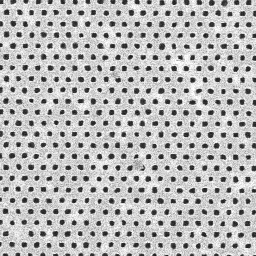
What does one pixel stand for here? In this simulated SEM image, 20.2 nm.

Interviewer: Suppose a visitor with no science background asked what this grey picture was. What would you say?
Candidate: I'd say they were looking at a regular array of holes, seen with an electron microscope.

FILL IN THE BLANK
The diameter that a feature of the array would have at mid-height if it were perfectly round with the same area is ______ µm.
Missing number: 0.114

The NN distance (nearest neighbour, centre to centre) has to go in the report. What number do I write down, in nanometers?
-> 243